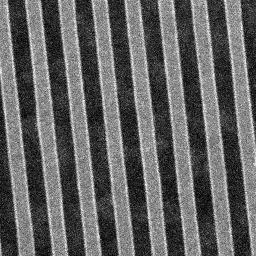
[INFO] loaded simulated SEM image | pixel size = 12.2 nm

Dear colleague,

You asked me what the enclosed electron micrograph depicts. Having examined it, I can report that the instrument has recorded parallel lines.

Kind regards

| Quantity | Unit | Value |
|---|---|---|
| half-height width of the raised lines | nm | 167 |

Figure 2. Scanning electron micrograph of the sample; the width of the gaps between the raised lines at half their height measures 235 nm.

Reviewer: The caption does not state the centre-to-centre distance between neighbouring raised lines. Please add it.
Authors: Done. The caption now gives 33 pixels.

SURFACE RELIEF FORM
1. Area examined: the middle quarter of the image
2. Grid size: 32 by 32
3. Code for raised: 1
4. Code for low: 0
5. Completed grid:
01110000011100000111100000111000
01110000011100000111100000111000
01110000011100000111100000111000
01110000011110000111100000111000
01110000011110000111100000111000
01110000011110000011100000111000
01111000001110000011100000111000
01111000001110000011100000111100
00111000001110000011100000111100
00111000001110000011100000011100
00111000001110000011110000011100
00111000001110000011110000011100
00111000001111000011110000011100
00111000001111000001110000011100
00111000001111000001110000011100
00111100000111000001110000011100
00111100000111000001110000011110
00111100000111000001110000011110
00011100000111000001110000011110
00011100000111000001111000001110
00011100000111000001111000001110
00011100000111000000111000001110
00011100000111100000111000001110
00011100000111100000111000001110
00011110000011100000111000001110
00011110000011100000111000001111
00011110000011100000111100001111
00011110000011100000111100001111
00011110000011100000111100001111
00001110000011100000111100001111
00001110000011100000011100000111
00001110000011110000011100000111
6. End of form